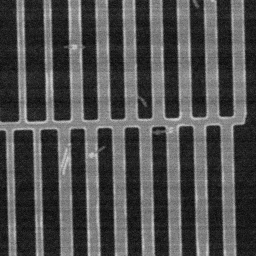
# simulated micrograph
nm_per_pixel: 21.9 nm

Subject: groups of lines, slits or small figures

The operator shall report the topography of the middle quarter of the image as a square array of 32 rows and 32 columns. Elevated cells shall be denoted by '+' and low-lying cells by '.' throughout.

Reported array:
..++....+++....+++....+++....+++
..++....+++....+++....+++....+++
..++.....++....+++....+++....+++
..++.....++....+++....+++....+++
..++.....++....+++....+++....+++
..+++....++....+++....+++....+++
..+++....++....+++....+++....+++
..+++....++....+++....+++....+++
..+++....++....++++...+++....+++
..+++....++....+++....+++....+++
..+++....++....+++....+++....+++
..+++....++....+++....+++....+++
..+++....++.....++....+++....+++
..+++....+++...++++...++++...+++
++++++++++++++++++++++++++++++++
+++++++++++++++++++++++..++++...
++...+++....+++....+++...+++....
+.....++....+++....+++....++....
+.....++....+++....+++....++....
+.....++....+++....+++....++....
++....++....+++....+++....++....
++....+++...+++....+++....+++...
++....++....+++....+++....+++...
++....++....+++....+++....+++...
++....++....+++....+++....+++...
++....++....+++....+++....+++...
++....++.....++....+++....+++...
++....++.....++....+++....+++...
++....++.....++....+++....+++...
++....++.....++....+++....+++...
++....++.....++....+++....+++...
++....+++....++....+++....+++...